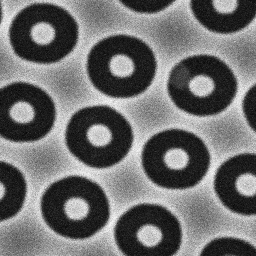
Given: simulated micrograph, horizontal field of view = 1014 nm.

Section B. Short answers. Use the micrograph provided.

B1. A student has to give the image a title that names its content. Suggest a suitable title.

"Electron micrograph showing ring-shaped grooves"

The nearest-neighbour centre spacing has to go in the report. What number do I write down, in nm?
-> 304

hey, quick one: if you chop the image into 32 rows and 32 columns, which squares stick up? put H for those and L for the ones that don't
HHHHLLLHHHHHHHHLLLLLLHHHLLLHHHLL
HHLLLLLLLHHHHHHHHLLLHHHHLLLLHLLL
HHLLLLLLLHHHHHHHHHHHHHHHHLLLLLLL
HLLLHHHLLLHHHHHHHHHHHHHHHHLLLLLH
HLLLHHHLLLHHHHLLHHHHHHHHHHHHHHHH
HLLLLHLLLLHHLLLLLLHHHHHHHHHHHHHH
HHLLLLLLLHHLLLLLLLLHHHHHHHHHHHHH
HHHLLLLLHHHLLLHHLLLHHHHLLLLLHHHH
HHHHHHHHHHHLLLHHHLLLHLLLLLLLLHHH
HHHHHHHHHHHLLLLHLLLHHLLLLLLLLHHH
HLLLHHHHHHHHLLLLLLLHHLLLHHHLLLHH
LLLLLLHHHHHHHLLLLLHHHLLLHHLLLLHL
LLLLLLLHHHHHHHHHHHHHHLLLLLLLLHLL
LHHHLLLHHHLLLLHHHHHHHHLLLLLLHHLL
LHHHLLLHHLLLLLLHHHHHHHHHHLHHHHHL
LLLLLLLHLLLLLLLLHHHHHHHHHHHHHHHL
LLLLLLHHLLLHHHLLLHHHLLLLHHHHHHHH
HLLLLHHHLLLHHHLLLHHLLLLLLHHHHHHH
HHHHHHHHLLLLLLLLHHLLLLLLLLHHHHHH
HHHHHHHHHLLLLLLLHHLLLHHLLLHHHLLL
LHHHHHHHHHHLLLLHHHLLLHHLLLHHLLLL
LLLHHHHHHHHHHHHHHHLLLLLLLLHLLLLL
LLLHHHHLLLLHHHHHHHHLLLLLLHHLLLHH
LLLHHHLLLLLLLHHHHHHHLLLLHHHLLLHH
LLLHHLLLLLLLLHHHHHHHHHHHHHHLLLLL
LLLHHLLLHHHLLLHHHLLLHHHHHHHHLLLL
LLHHHLLLHHHLLLHHLLLLLHHHHHHHHLLL
LHHHHLLLLLLLLLHLLLLLLLHHHHHHHHHH
HHHHHHLLLLLLLHLLLLHLLLLHHHHHHHHH
HHHHHHHHLLLLHHLLLHHHLLLHHHHHHHHH
HHHHHHHHHHHHHHHLLLHHLLLHHHLLLLLH
HHHHHHHHHHHHHHHLLLLLLLHHHLLLLLLL